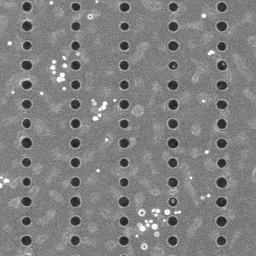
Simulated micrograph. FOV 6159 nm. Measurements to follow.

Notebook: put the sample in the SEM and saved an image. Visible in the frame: a regular array of raised bodies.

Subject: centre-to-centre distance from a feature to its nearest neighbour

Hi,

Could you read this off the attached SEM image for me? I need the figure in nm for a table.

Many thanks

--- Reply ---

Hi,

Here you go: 465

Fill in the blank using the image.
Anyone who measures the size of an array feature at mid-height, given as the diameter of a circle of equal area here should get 266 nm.